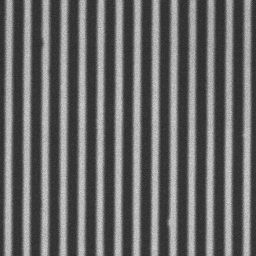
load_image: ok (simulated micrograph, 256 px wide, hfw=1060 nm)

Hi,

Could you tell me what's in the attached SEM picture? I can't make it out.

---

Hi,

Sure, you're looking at parallel lines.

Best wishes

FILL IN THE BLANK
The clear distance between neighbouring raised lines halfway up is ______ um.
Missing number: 0.0461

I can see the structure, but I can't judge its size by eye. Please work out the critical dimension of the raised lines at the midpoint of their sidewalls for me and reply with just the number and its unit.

28.5 nm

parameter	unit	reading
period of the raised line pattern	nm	76